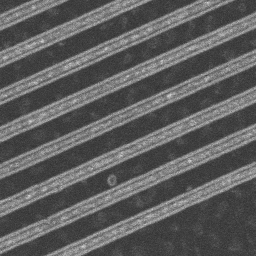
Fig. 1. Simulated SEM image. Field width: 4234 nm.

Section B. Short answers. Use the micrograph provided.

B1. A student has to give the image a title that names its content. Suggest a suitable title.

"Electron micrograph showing parallel lines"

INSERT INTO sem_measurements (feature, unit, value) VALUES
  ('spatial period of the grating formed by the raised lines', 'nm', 563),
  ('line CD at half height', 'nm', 376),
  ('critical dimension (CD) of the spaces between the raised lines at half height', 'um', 0.187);